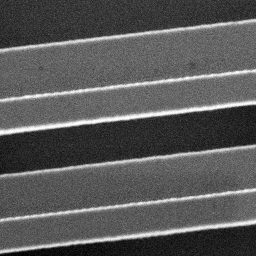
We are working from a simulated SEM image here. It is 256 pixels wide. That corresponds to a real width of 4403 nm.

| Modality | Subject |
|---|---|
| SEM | lines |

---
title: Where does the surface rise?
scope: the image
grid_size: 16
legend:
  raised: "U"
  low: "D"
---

DDDDDDDDDDDDDDDD
DDDDDDDDDDDDDDUU
DDDDDDUUUUUUUUUU
UUUUUUUUUUUUUUUU
UUUUUUUUUUUUUUUU
UUUUUUUUUUUUUUUU
UUUUUUUUUUUUUUUU
UUUUUUUDDDDDDDDD
DDDDDDDDDDDDDDDD
DDDDDDDDDDDDDUUU
DDDDUUUUUUUUUUUU
UUUUUUUUUUUUUUUU
UUUUUUUUUUUUUUUU
UUUUUUUUUUUUUUUU
UUUUUUUUUUUDDDDD
UUDDDDDDDDDDDDDD